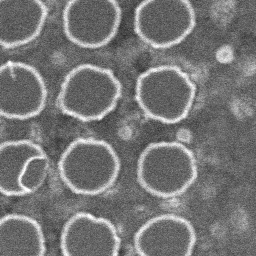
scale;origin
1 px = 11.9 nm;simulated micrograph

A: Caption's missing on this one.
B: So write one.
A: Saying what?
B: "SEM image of raised bodies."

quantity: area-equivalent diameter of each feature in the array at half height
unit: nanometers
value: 660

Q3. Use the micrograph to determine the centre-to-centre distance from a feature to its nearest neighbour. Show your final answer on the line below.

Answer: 886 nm